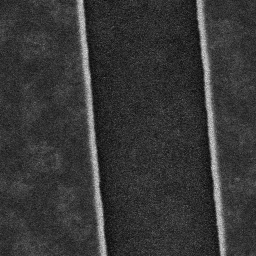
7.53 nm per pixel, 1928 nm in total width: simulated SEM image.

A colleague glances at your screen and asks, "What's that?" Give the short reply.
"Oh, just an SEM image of one or a few lines or trenches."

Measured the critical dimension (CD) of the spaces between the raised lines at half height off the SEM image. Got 889 nm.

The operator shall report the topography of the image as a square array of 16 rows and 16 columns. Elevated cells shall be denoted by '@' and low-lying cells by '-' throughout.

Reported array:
@@@@@-------@@@@
@@@@@--------@@@
@@@@@--------@@@
@@@@@--------@@@
@@@@@--------@@@
@@@@@@-------@@@
@@@@@@-------@@@
@@@@@@-------@@@
@@@@@@-------@@@
@@@@@@-------@@@
@@@@@@-------@@@
@@@@@@-------@@@
@@@@@@--------@@
@@@@@@--------@@
@@@@@@--------@@
@@@@@@--------@@